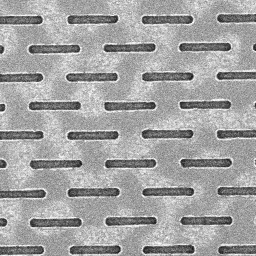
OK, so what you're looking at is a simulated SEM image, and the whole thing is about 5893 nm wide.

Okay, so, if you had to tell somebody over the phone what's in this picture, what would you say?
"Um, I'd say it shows a regular array of holes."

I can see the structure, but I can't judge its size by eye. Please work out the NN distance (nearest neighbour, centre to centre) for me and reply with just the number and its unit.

1070 nanometres